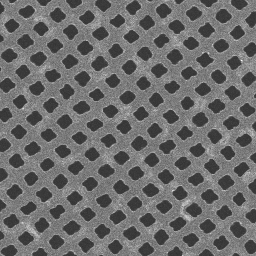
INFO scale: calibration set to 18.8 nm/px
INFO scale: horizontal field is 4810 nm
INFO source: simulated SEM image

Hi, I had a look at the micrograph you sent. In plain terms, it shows a regular array of holes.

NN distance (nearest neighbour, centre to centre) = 386 nm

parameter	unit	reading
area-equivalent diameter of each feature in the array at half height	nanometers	251